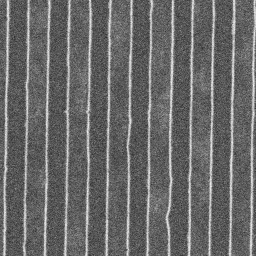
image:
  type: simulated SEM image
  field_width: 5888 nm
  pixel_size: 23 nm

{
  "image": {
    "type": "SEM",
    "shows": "parallel lines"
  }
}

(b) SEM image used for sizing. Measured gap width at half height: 454 nm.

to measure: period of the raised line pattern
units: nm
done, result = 946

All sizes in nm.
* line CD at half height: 477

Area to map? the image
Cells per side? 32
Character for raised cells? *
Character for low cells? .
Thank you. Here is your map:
*...**...**...**...***..***..***
*...**...**...**...***..***..***
*...**...**...**...***..***..***
*...**...**...**...***..***..***
*...**...**...**...***..***..***
*...**...**...**...***..***..***
*...**...**...**...***..***..***
*...**...**...**...***..***..***
*...**...**...**...**...***..***
*...**...**...**...**...***..***
*..***...**...**...**...***..***
*..***...**...**...**...**...***
*..***...**...**...**...**...***
*..***..***...**...**...**...***
*..***..***...**...**...**...***
*..***..***...**...**...**...***
*..***..***...**...**...**...**.
*..***..***...**...**...**...**.
*..***..***..***...**...**...**.
*..***..***..***...**...**...**.
*..***..***..***...**...**...**.
*..***..***...**...**...**...**.
*..***..***...**...**...**...**.
*..***..***...**...**...**...**.
...***..***..***...**...**...**.
*..***..***..***...**...**...**.
*..***..***..***...**...**...**.
*..***..***..***..***...**...**.
*..***..***..***..***...**...**.
*..***..***..***..***...**...**.
*..***..***..***..***...**...**.
...***..***..***..***...**...**.